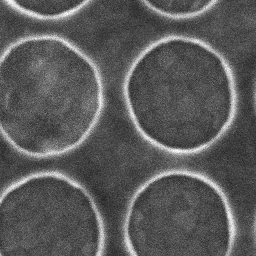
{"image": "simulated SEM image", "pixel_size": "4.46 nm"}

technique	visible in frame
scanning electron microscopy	holes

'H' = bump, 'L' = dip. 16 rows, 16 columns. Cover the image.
HLLLLHHHHHLLLHHH
HHHHHHHHHHHHHHHH
HHHHHHHHHHHHHHHH
HHHHHHHHHLLLLLHH
HHHHHHHHLLLLLLHH
HHHHHHHHLLLLLLHH
HHHHHHHHLLLLLLHH
HHHHHHHHHLLLLLHH
HHHHHHHHHLLLLLHH
HHHHHHHHHHHHHHHH
HHHHHHHHHHHHHHHH
HLLLLHHHHLLLLHHH
LLLLLLHHLLLLLLHH
LLLLLLHHLLLLLLHH
LLLLLLHHLLLLLLHH
LLLLLLHHLLLLLLHH